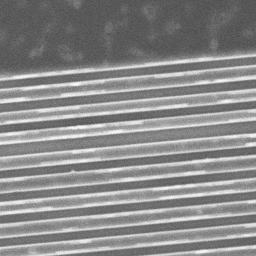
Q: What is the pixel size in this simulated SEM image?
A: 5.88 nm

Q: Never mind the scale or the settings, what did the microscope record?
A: parallel lines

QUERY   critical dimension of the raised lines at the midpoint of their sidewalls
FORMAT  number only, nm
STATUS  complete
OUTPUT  71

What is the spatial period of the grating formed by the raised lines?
132 nm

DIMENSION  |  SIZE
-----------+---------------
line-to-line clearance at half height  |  56.3 nm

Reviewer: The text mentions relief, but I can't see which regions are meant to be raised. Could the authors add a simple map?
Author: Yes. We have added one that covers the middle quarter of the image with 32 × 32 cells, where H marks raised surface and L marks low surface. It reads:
HHHHHHHHHHHHHHHHHHHLLLLLLLLLLLLL
HHHHHHHHHLLLLLLLLLLLLLLLLLLLLLLL
LLLLLLLLLLLLLLLLLLLLLLLLLLLLHHHH
LLLLLLLLLLLLLLLLLHHHHHHHHHHHHHHH
LLLLLLHHHHHHHHHHHHHHHHHHHHHHHHHH
HHHHHHHHHHHHHHHHHHHHHHHHHHHHLLLL
HHHHHHHHHHHHHHHHHHLLLLLLLLLLLLLL
HHHHHHHLLLLLLLLLLLLLLLLLLLLLLLLL
LLLLLLLLLLLLLLLLLLLLLLLLLLHHHHHH
LLLLLLLLLLLLLLLLHHHHHHHHHHHHHHHH
LLLLLHHHHHHHHHHHHHHHHHHHHHHHHHHL
HHHHHHHHHHHHHHHHHHHHLLLLLLLLLLLL
HHHHHHHHHHLLLLLLLLLLLLLLLLLLLLLL
LLLLLLLLLLLLLLLLLLLLLLLLLLHHHHHH
LLLLLLLLLLLLLLLHHHHHHHHHHHHHHHHH
LLLHLHHHHHHHHHHHHHHHHHHHHHHHHHHL
HHHHHHHHHHHHHHHHHHHHLLLLLLLLLLLL
HHHHHHHHHLLLLLLLLLLLLLLLLLLLLLLL
HLLLLLLLLLLLLLLLLLLLLLLLLLLLLLLL
LLLLLLLLLLLLLLLLLLLLLLLLLLLHHHHH
LLLLLLLLLLLLLLLLHHHHHHHHHHHHHHHH
LLLLLLHHHHHHHHHHHHHHHHHHHHHHHHHH
HHHHHHHHHHHHHHHHHHHHHHHHHLLLLLLL
HHHHHHHHHHHHHHHLLLLLLLLLLLLLLLLL
HHHHLLLLLLLLLLLLLLLLLLLLLLLLLLLH
LLLLLLLLLLLLLLLLLLLLLHHHHHHHHHHH
LLLLLLLLLLHHHHHHHHHHHHHHHHHHHHHH
HHHHHHHHHHHHHHHHHHHHHHHHHHHHHHHH
HHHHHHHHHHHHHHHHHHHHHHLLLLLLLLLL
HHHHHHHHHHHLLLLLLLLLLLLLLLLLLLLL
HLLLLLLLLLLLLLLLLLLLLLLLLLLLHHHH
LLLLLLLLLLLLLLLLLLLHHHHHHHHHHHHH